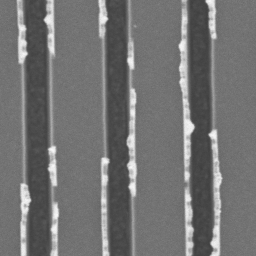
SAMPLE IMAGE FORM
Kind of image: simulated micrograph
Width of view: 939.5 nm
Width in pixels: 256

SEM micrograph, one or a few lines or trenches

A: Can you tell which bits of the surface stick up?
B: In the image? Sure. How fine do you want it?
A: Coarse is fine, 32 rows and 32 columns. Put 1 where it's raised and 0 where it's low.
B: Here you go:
11100011111110001111111000111111
11100011111110001111111000111111
11100011111110001111111000111111
11100011111110001111111000111111
11100011111110001111111000111111
11100011111110001111111000111111
11100011111110001111111000111111
11100011111110001111111000111111
11100011111110001111111000111111
11100011111110001111111000111111
11100011111110001111111000111111
11100011111110001111111100111111
11100011111110001111111100111111
11100011111110001111111100111111
11100011111110001111111100011111
11100011111110001111111100011111
11100011111110001111111100111111
11100011111110001111111100111111
11100011111110001111111100011111
11100011111110001111111100011111
11100011111111001111111100011111
11100011111110001111111100011111
11100011111110001111111100011111
11110011111110001111111100011111
11110011111110001111111100011111
11110011111110001111111100011111
11100011111110001111111100011111
11100011111110001111111100011111
11100011111110001111111100011111
11100011111110001111111100011111
11100011111110001111111100111111
11100011111111001111111100011111